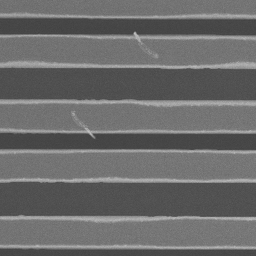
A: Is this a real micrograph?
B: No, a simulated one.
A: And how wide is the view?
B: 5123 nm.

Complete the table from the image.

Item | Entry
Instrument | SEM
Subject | lines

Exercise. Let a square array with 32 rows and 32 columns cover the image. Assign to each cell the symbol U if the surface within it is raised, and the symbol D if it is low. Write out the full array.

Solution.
UUUUUUUUUUUUUUUUUUUUUUUUUUUUUUUU
UUUUUUUUUUUUUUUUUUUUUUUUUUUUUUUU
DDDDDDDDDDDDDDDDDDDDDDDDDDDDDDDD
DDDDDDDDDDDDDDDDDDDDDDDDDDDDDDDD
UUUUUUUUUUUUUUUUUUUUUUUUUUUUUUUU
UUUUUUUUUUUUUUUUUUUUUUUUUUUUUUUU
UUUUUUUUUUUUUUUUUUUUUUUUUUUUUUUU
UUUUUUUUUUUUUUUUUUUUUUUUUUUUUUUU
DDDDDDDDDDDDDDDDDDDDDDDDDDDDDDDD
DDDDDDDDDDDDDDDDDDDDDDDDDDDDDDDD
DDDDDDDDDDDDDDDDDDDDDDDDDDDDDDDD
DDDDDDDDDDDDDDDDDDDDDDDDDDDDDDDD
DDDDDDDDDDDDDDDDDDDDDDDDDDDDDDDD
UUUUUUUUUUUUUUUUUUUUUUUUUUUUUUUU
UUUUUUUUUUUUUUUUUUUUUUUUUUUUUUUU
UUUUUUUUUUUUUUUUUUUUUUUUUUUUUUUU
UUUUUUUUUUUUUUUUUUUUUUUUUUUUUUUU
DDDDDDDDDDDDDDDDDDDDDDDDDDDDDDDD
DDDDDDDDDDDDDDDDDDDDDDDDDDDDDDDD
UUUUUUUUUUUUUUUUUUUUUUUUUUUUUUUU
UUUUUUUUUUUUUUUUUUUUUUUUUUUUUUUU
UUUUUUUUUUUUUUUUUUUUUUUUUUUUUUUU
UUUUUUUUUUUUUUUUUUUUUUUUUUUUUUUU
DDDDDDDDDDDDDDDDDDDDDDDDDDDDDDDD
DDDDDDDDDDDDDDDDDDDDDDDDDDDDDDDD
DDDDDDDDDDDDDDDDDDDDDDDDDDDDDDDD
DDDDDDDDDDDDDDDDDDDDDDDDDDDDDDDD
UUUUUUUUUUUUUUUUUUUUUUUUUUUUUUUU
UUUUUUUUUUUUUUUUUUUUUUUUUUUUUUUU
UUUUUUUUUUUUUUUUUUUUUUUUUUUUUUUU
UUUUUUUUUUUUUUUUUUUUUUUUUUUUUUUU
DDDDDDDDDDDDDDDDDDDDDDDDDDDDDDDD